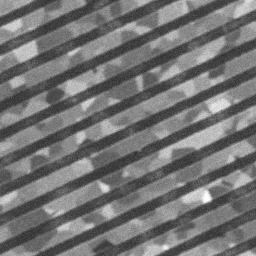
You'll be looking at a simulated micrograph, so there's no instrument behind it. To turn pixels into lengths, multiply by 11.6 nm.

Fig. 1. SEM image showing parallel lines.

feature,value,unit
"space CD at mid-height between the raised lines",138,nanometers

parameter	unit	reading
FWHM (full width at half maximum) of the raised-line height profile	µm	0.158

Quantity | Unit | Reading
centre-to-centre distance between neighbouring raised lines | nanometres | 297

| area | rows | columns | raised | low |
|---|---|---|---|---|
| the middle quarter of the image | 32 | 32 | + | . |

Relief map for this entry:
++.......++++++++.......++++++++
.......++++++++.......++++++++..
.....++++++++.......++++++++....
...++++++++.......++++++++......
.++++++++......+++++++++.......+
+++++++.......++++++++.......+++
+++++.......+++++++.......++++++
++........+++++++.......++++++++
.......++++++++.......++++++++..
.....++++++++.......++++++++....
...++++++++.......++++++++......
.++++++++.......++++++++.......+
+++++++.......++++++++.......+++
+++++.......++++++++.......+++++
+++.......+++++++........+++++++
........++++++++......++++++++..
.....++++++++.......+++++++++...
...++++++++.......++++++++......
.++++++++.......++++++++.......+
+++++++.......++++++++.......+++
+++++.......++++++++.......+++++
+++.......+++++++++......+++++++
+.......+++++++........++++++++.
......+++++++........++++++++...
...++++++++.......++++++++......
.++++++++.......+++++++++.......
+++++++.......++++++++.......+++
+++++........+++++++.......+++++
+++.......++++++++.......+++++++
+.......++++++++.......++++++++.
......++++++++.......++++++++...
....++++++++.......+++++++......